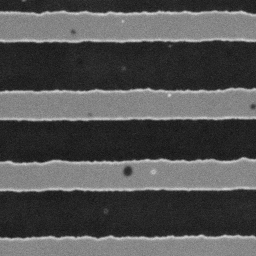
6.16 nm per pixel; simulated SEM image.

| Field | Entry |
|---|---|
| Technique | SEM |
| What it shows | lines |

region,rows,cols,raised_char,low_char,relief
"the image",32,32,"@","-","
--------------------------------
-------@@-@--------@---@--@@@-@-
@@@@@@@@@@@@@@@@@@@@@@@@@@@@@@@@
@@@@@@@@@@@@@@@@@@@@@@@@@@@@@@@@
@@@@@@@@@@@@@@@@@@@@@@@@@@@@@@@@
--------------------------------
--------------------------------
--------------------------------
--------------------------------
--------------------------------
--------------------------------
@@@@@@@@@@-@@@@@@@@@@@@@@@@@@@@@
@@@@@@@@@@@@@@@@@@@@@@@@@@@@@@@@
@@@@@@@@@@@@@@@@@@@@@@@@@@@@@@@@
@@@@@@@@@@@@@@@@@@@@@@@@@@@@@@@@
--------------------------------
--------------------------------
--------------------------------
--------------------------------
--------------------------------
@@@@@@@@@@@@@@@@@@@@@@@@@@@@@@@@
@@@@@@@@@@@@@@@@@@@@@@@@@@@@@@@@
@@@@@@@@@@@@@@@@@@@@@@@@@@@@@@@@
@@@@@@@@@@@@@@@@@@@@@@@@@@@@@@@@
--------------------------------
--------------------------------
--------------------------------
--------------------------------
--------------------------------
------------------------@@--@@--
@@@@@@@@@@@@@@@@@@@@@@@@@@@@@@@@
@@@@@@@@@@@@@@@@@@@@@@@@@@@@@@@@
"